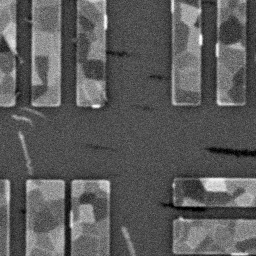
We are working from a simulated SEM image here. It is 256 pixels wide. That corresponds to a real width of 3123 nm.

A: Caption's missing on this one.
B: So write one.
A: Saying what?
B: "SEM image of groups of lines, slits or small figures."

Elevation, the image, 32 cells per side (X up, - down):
XX--XXXX--XXX---------XXX--XXXX-
XX--XXX---XXX---------XXX--XXXX-
XX--XXX---XXX---------XXX--XXXX-
XX--XXXX--XXX---------XXX--XXXX-
XX--XXXX--XXX---------XXX--XXXX-
XX--XXX---XXX---------XXX--XXXX-
XX--XXX---XXX---------XXX--XXXX-
XX--XXX---XXX---------XXX--XXXX-
XX--XXX---XXX---------XXX--XXXX-
XX--XXX---XXX---------XXX--XXXX-
XX--XXX---XXX---------XXX--XXXX-
XX--XXX---XXX---------XXX--XXXX-
XX--XXX---XXX---------XXX--XXXX-
--------------------------------
--------------------------------
--------------------------------
--------------------------------
--------------------------------
--------------------------------
--------------------------------
--------------------------------
--------------------------------
----------------------XXXXXXXXXX
X--XXXXX-XXXXX--------XXXXXXXXXX
X--XXXXX-XXXX---------XXXXXXXXXX
X--XXXXX-XXXX---------XXXXXXXXXX
X--XXXXX-XXXXX------------------
X--XXXXX-XXXXX--------XX--------
X--XXXXX-XXXXX--------XXXXXXXXXX
X--XXXXX-XXXXX--------XXXXXXXXXX
X--XXXXX-XXXX---------XXXXXXXXXX
X--XXXXX-XXXX---------XXXXXXXXXX